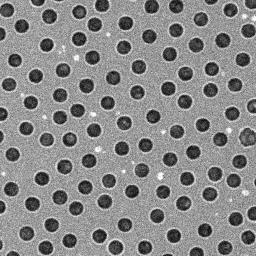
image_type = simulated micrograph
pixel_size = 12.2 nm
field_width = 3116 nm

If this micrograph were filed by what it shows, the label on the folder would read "a regular array of holes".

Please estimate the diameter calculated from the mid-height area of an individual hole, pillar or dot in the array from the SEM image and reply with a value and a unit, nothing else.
187 nm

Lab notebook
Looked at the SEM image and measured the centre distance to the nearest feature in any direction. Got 300 nm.